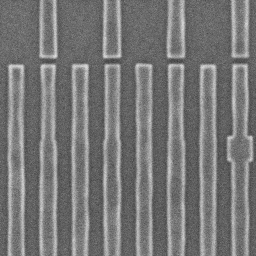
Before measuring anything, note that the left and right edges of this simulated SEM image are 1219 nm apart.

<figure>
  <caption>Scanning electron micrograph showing wiring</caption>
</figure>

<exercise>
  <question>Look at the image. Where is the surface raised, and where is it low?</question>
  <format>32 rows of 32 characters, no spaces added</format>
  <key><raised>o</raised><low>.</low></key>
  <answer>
.....oo......oo......oo......oo.
.....oo......oo......oo......oo.
.....oo......oo......oo......oo.
.....oo......oo......oo......oo.
.....oo......oo......oo......oo.
.....oo......oo......oo......oo.
.....oo......oo......oo......oo.
................................
.oo..oo..oo..oo..oo..oo..oo..oo.
.oo..oo..oo..oo..oo..oo..oo..oo.
.oo..oo..oo..oo..oo..oo..oo..oo.
.oo..oo..oo..oo..oo..oo..oo..oo.
.oo...o..oo..oo..oo..oo..oo..oo.
.oo...o..oo..oo..oo..oo..oo..oo.
.oo..oo..oo..oo..oo..oo..oo..oo.
.oo..oo..oo..oo..oo..oo..oo..oo.
.oo..oo..oo..oo..oo..oo..oo..oo.
.oo..oo..oo..oo..oo..oo..oo..oo.
.oo..oo..oo..oo..oo..oo..oo..oo.
.oo..oo..oo..oo..oo..oo..oo..oo.
.oo..oo..oo..oo..oo..oo..oo..oo.
.oo..oo..oo..oo..oo..oo..oo..oo.
.oo..oo..oo..oo..oo..oo..oo..oo.
.oo..oo..oo..oo..oo..oo..oo..oo.
.oo..oo..oo..oo..oo..oo..oo..oo.
.oo..oo..oo..oo..oo..oo..oo..oo.
.oo..oo..oo..oo..oo..oo..oo..oo.
.oo..oo..oo..oo..oo..oo..oo..oo.
.oo..oo..oo..oo..oo..oo..oo..oo.
.oo..oo..oo..oo..oo..oo..oo..oo.
.oo..oo..oo..oo..oo..oo..oo..oo.
.oo..oo..oo..oo..oo..oo..oo..oo.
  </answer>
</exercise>